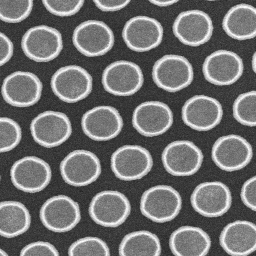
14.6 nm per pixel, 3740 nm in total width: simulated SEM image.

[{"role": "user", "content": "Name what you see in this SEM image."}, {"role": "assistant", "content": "a regular array of raised bodies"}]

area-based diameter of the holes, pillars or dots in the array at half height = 518 nm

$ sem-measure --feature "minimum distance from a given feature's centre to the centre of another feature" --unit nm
723